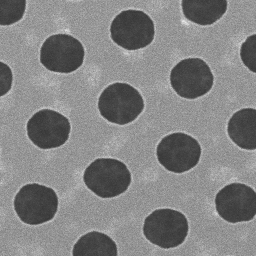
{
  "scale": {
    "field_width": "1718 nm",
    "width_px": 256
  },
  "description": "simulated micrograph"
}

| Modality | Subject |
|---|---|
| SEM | a regular array of holes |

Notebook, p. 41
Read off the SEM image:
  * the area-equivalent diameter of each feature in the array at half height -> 287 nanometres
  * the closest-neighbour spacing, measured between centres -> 506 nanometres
